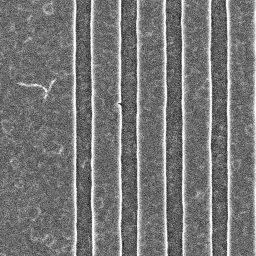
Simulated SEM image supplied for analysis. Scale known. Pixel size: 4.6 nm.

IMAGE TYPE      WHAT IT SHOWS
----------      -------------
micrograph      parallel lines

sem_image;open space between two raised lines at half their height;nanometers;77.6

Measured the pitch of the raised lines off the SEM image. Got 208 nanometres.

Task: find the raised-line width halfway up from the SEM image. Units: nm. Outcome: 132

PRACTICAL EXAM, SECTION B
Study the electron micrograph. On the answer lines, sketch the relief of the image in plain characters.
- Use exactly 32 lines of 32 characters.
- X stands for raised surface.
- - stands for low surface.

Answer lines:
XXXXXXXXX--XXXX--XXXX--XXX--XXXX
XXXXXXXXX--XXXX--XXXX--XXX--XXXX
XXXXXXXXX--XXXX--XXXX--XXX--XXXX
XXXXXXXXX--XXXX--XXXX--XXX--XXXX
XXXXXXXXX--XXXX--XXXX--XXX--XXXX
XXXXXXXXX--XXXX--XXXX--XXX--XXXX
XXXXXXXXX--XXXX--XXXX--XXX--XXXX
XXXXXXXXX--XXXX--XXXX--XXX---XXX
XXXXXXXXX--XXXX--XXXX--XXX---XXX
XXXXXXXXX--XXXX--XXXX--XXX---XXX
XXXXXXXXX---XXX--XXXX--XXX---XXX
XXXXXXXXX---XXX--XXXX--XXX---XXX
XXXXXXXXX---XXX--XXXX--XXX---XXX
XXXXXXXXX---XXX--XXXX--XXX---XXX
XXXXXXXXX---XXX--XXXX--XXX---XXX
XXXXXXXXX---XXX--XXXX--XXX---XXX
XXXXXXXXX---XXX--XXXX--XXX---XXX
XXXXXXXXX---XXX--XXXX--XXX---XXX
XXXXXXXXX---XXX--XXXX--XXX---XXX
XXXXXXXXX---XXX--XXXX--XXX---XXX
XXXXXXXXX--XXXX--XXXX--XXX---XXX
XXXXXXXXX---XXX--XXXX--XXX---XXX
XXXXXXXXX---XXX--XXXX--XXX---XXX
XXXXXXXXX---XXX--XXXX--XXX---XXX
XXXXXXXXX---XXX--XXXX--XXX---XXX
XXXXXXXXX---XXX--XXXX--XXX---XXX
XXXXXXXXX---XXX--XXXX--XXX---XXX
XXXXXXXXX---XXX--XXXX--XXX---XXX
XXXXXXXXX---XXX--XXXX--XXX---XXX
XXXXXXXXXX--XXX--XXXX--XXX---XXX
XXXXXXXXXX--XXX--XXXX--XXX---XXX
XXXXXXXXX---XXX--XXXX--XXX--XXXX